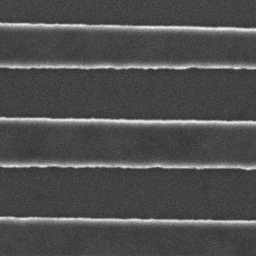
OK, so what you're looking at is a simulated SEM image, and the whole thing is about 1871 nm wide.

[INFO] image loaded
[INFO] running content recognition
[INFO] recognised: lines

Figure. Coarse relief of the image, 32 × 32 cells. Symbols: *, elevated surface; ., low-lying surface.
................................
................................
................................
*************************.......
********************************
********************************
********************************
********************************
..........**..**..**.**......***
................................
................................
................................
................................
................................
................................
********************************
********************************
********************************
********************************
********************************
********************************
................................
................................
................................
................................
................................
................................
**************..*...............
********************************
********************************
********************************
********************************